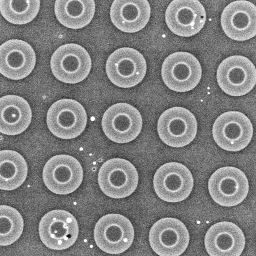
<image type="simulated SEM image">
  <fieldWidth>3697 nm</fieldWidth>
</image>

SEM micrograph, an array of small figures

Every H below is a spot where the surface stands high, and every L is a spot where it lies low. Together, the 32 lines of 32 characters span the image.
HHHHHLLHHHHHLLHHHHHLLHHHHLLLLHHH
HHHHHLLHHHHHLLHHHHHLLHHHHHLLHHHH
LHHHLLLHHHHLLLHHHHHLLHHHHHLLHHHH
LLLLLLLLLHLLLLLHHHLLLHHHHLLLHHHH
LLLLLLLLLLLLLLLLLLLLLLLHLLLLLHHH
HHHHLLLLLLLLLLLLLLLLLLLLLLLLLLLL
HHHHLLLHHHHLLLHHHLLLLLLLLLLLLLLL
HHHHLLHHHHHLLHHHHHLLLHHHHLLLHHHL
HHHHLLHHHHHLLHHHHHLLHHHHHLLHHHHH
LHHLLLLHHHHLLHHHHHLLHHHHHLLHHHHH
LLLLLLLLLLLLLLHHHLLLLHHHHLLHHHHH
LLLLLLLLLLLLLLLLLLLLLLLLLLLLHHHL
HHHLLLLLHLLLLLLLLLLLLLLLLLLLLLLL
HHHHLLHHHHLLLLHHHLLLLHHLLLLLLLLL
HHHHLLHHHHHLLHHHHHLLHHHHLLLHHHHL
HHHHLLHHHHHLLHHHHHLLHHHHHLLHHHHL
HHHLLLHHHHLLLHHHHLLLHHHHHLLHHHHH
LLLLLLLLLLLLLLHHHLLLHHHHLLLHHHHL
LLLLLLLLLLLLLLLLLLLLLLLLLLLLHHLL
HHHLLLLHHLLLLLLLLLLLLLLLLLLLLLLL
HHHLLLHHHHLLLHHHLLLLLHHLLLLLLLLL
HHHLLHHHHHLLHHHHHLLLHHHHLLLHHHLL
HHHLLHHHHHLLHHHHHLLHHHHHLLHHHHHL
HHLLLLHHHHLLLHHHHLLHHHHHLLHHHHHL
LLLLLLLLLLLLLLHHLLLLHHHLLLHHHHHL
LLLLLLLLLLLLLLLLLLLLLLLLLLLHHHLL
HHLLLLHHLLLLLLLLLLLLLLLLLLLLLLLL
HHHLLHHHHLLLHHHHLLLLHHLLLLLLLLLL
HHHLLHHHHHLLHHHHHLLHHHHLLLHHHHLL
HHLLLHHHHHLLHHHHHLLHHHHHLLHHHHLL
HLLLLLHHHLLLHHHHLLLHHHHLLLHHHHHL
LLLLLLLLLLLLLHHLLLLHHHHLLLHHHHLL